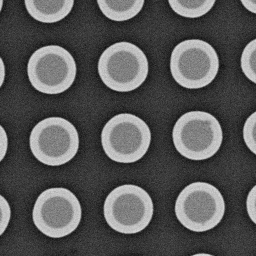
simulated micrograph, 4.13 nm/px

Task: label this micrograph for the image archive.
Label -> an array of small figures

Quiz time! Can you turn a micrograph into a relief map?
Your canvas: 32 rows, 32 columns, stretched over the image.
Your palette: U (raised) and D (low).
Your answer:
DDDUUUUUUDDDUUUUUUDDDUUUUUUDDDUU
DDDDUUUUUDDDDUUUUDDDDDUUUUDDDDDD
DDDDDUUDDDDDDDUUDDDDDDDDDDDDDDDD
DDDDDDDDDDDDDDDDDDDDDDDDDDDDDDDD
DDDDDDDDDDDDDDDDDDDDDDDDDDDDDDDD
DDDDDDDDDDDDDDUUDDDDDDUUUUDDDDDU
DDDDUUUUDDDDDUUUUUDDDDUUUUUDDDUU
DDDDUUUUUDDDUUUUUUDDDUUUUUUDDDUU
DDDDUUUUUDDDUUUUUUDDDUUUUUUDDDUU
UDDDUUUUUDDDDUUUUUDDDDUUUUUDDDDU
DDDDUUUUUDDDDUUUUUDDDDDUUUDDDDDD
DDDDDUUUDDDDDDDDDDDDDDDDDDDDDDDD
DDDDDDDDDDDDDDDDDDDDDDDDDDDDDDDD
DDDDDDDDDDDDDDDDDDDDDDDDDDDDDDDD
DDDDDDDDDDDDDDUUUDDDDDDUUUDDDDDU
DDDDDUUUUDDDDUUUUUDDDDUUUUUDDDDU
UDDDUUUUUUDDDUUUUUUDDDUUUUUUDDUU
UDDDUUUUUUDDDUUUUUUDDDUUUUUUDDDU
UDDDUUUUUUDDDUUUUUDDDDUUUUUDDDDU
DDDDUUUUUDDDDDUUUUDDDDDUUUDDDDDD
DDDDDDUUDDDDDDDDDDDDDDDDDDDDDDDD
DDDDDDDDDDDDDDDDDDDDDDDDDDDDDDDD
DDDDDDDDDDDDDDDDDDDDDDDDDDDDDDDD
DDDDDDDDDDDDDDDUUDDDDDDUUUUDDDDD
DDDDDUUUUDDDDDUUUUUDDDUUUUUUDDDU
UDDDUUUUUUDDDUUUUUUDDDUUUUUUDDDU
UDDDUUUUUUDDDUUUUUUDDDUUUUUUDDDU
UDDDUUUUUUDDDUUUUUUDDDUUUUUUDDDD
UDDDDUUUUDDDDDUUUUDDDDDUUUDDDDDD
DDDDDDUUDDDDDDDDDDDDDDDDDDDDDDDD
DDDDDDDDDDDDDDDDDDDDDDDDDDDDDDDD
DDDDDDDDDDDDDDDDDDDDDDDDDDDDDDDD